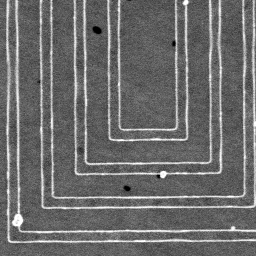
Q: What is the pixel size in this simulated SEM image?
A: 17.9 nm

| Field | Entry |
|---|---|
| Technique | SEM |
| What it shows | groups of lines, slits or small figures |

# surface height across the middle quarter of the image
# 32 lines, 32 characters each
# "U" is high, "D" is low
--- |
DDDUUDDDDDDUUUDDDDDDDDDDDDDDUUUD
DDDUUDDDDDDUUUDDDDDDDDDDDDDDUUUD
DDDUUDDDDDDUUUDDDDDDDDDDDDDDUUUD
DDDUUDDDDDDUUUDDDDDDDDDDDDDDUUUD
DDDUUDDDDDDUUUDDDDDDDDDDDDDDUUUD
DDDUUDDDDDDUUUDDDDDDDDDDDDDDUUUD
DDDUUDDDDDDUUUDDDDDDDDDDDDDDUUUD
DDDUUDDDDDDUUUDDDDDDDDDDDDDDUUUD
DDDUUDDDDDDUUUDDDDDDDDDDDDDDUUUD
DDDUUDDDDDDUUUDDDDDDDDDDDDDDUUUD
DDDUUDDDDDDUUUDDDDDDDDDDDDDDUUUD
DDDUUDDDDDDUUUDDDDDDDDDDDDDDUUUD
DDDUUDDDDDDUUUDDDDDDDDDDDDDDUUDD
DDDUUDDDDDDUUUDDDDDDDDDDDDDDUUDD
DDDUUDDDDDDUUUDDDDDDDDDDDDDDUUUD
DDDUUDDDDDDUUUDDDDDDDDDDDDDDUUUD
DDDUUDDDDDDUUUUUUUUUUUUUUUUUUUUD
DDDUUDDDDDDUUUUUUUUUUUUUUUUUUUUD
DDDUUDDDDDDUUUUUUUUUUUUUUUUUUUUD
DDDUUDDDDDDDDDDDDDDDDDDDDDDDDDDD
DDDUUDDDDDDDDDDDDDDDDDDDDDDDDDDD
DDDUUDDDDDDDDDDDDDDDDDDDDDDDDDDD
DDDUUDDDDDDDDDDDDDDDDDDDDDDDDDDD
DDDUUDDDDDDDDDDDDDDDDDDDDDDDDDDD
DDDUUUDDDDDDDDDDDDDDDDDDDDDDDDDD
DDDUUUUUUUUUUUUUUUUUUUUUUUUUUUUU
DDDUUUUUUUUUUUUUUUUUUUUUUUUUUUUU
DDDDDDDDDDDDDDDDDDDDDDDDUUDDDDDD
DDDDDDDDDDDDDDDDDDDDDDDDDDDDDDDD
DDDDDDDDDDDDDDDDDDDDDDDDDDDDDDDD
DDDDDDDDDDDDDDDDDDDDDDDDDDDDDDDD
DDDDDDDDDDDDDDDDDDDDDDDDDDDDDDDD